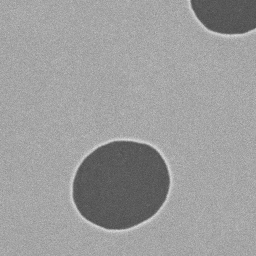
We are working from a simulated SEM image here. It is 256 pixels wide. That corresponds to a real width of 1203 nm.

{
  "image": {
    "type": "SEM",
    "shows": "holes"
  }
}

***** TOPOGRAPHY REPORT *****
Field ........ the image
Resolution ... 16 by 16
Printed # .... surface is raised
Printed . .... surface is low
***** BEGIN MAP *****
############....
#############...
################
################
################
################
################
################
################
######....######
#####.....######
#####......#####
#####.....######
#####....#######
################
################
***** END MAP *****